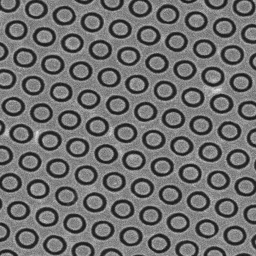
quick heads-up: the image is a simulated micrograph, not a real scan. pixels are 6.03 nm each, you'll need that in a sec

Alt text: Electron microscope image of a regular array of ring-shaped grooves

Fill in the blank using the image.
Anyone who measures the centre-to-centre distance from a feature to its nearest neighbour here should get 28.3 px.